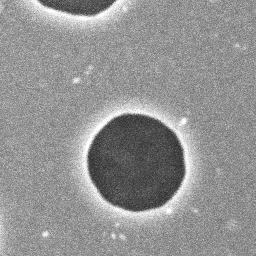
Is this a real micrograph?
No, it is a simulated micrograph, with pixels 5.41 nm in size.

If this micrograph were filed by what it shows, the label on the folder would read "holes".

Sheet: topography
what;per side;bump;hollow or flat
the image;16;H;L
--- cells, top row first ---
HHHLLLLHHHHHHHHH
HHHHHHHHHHHHHHHH
HHHHHHHHHHHHHHHH
HHHHHHHHHHHHHHHH
HHHHHHHHHHHHHHHH
HHHHHHHHHHHHHHHH
HHHHHHHHHHHHHHHH
HHHHHHHLLLHHHHHH
HHHHHHLLLLLHHHHH
HHHHHLLLLLLLHHHH
HHHHHLLLLLLLHHHH
HHHHHHLLLLLHHHHH
HHHHHHHLLLLHHHHH
HHHHHHHHHHHHHHHH
HHHHHHHHHHHHHHHH
HHHHHHHHHHHHHHHH